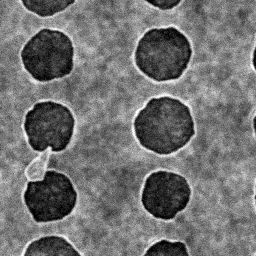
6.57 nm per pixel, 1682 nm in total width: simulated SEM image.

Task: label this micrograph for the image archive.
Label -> holes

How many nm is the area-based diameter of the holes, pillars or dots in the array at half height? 341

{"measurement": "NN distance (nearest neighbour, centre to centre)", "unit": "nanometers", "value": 465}